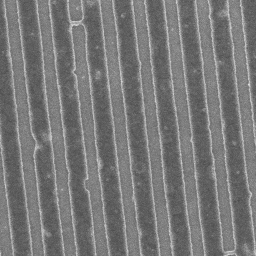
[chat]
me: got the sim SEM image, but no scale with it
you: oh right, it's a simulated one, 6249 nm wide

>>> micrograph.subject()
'parallel lines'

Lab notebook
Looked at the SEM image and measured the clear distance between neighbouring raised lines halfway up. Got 297 nanometers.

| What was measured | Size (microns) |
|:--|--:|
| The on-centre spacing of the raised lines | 0.775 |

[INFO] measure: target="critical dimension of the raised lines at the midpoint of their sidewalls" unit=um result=0.473